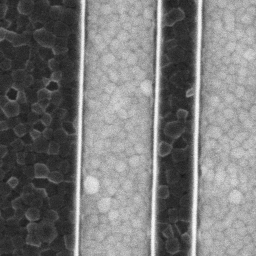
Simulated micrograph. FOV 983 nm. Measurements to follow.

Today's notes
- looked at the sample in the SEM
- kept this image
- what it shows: one or a few lines or trenches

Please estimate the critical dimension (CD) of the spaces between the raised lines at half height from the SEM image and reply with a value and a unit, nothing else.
286 nm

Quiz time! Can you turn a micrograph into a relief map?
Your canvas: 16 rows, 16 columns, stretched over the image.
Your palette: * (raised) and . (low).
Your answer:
*****.....***...
*****.....***...
*****.....**....
*****.....**....
*****.....**....
*****.....**....
*****.....**....
*****.....**....
*****.....**....
*****.....**....
*****.....**....
*****.....**....
*****.....**....
*****.....**....
*****.....**....
*****.....**....